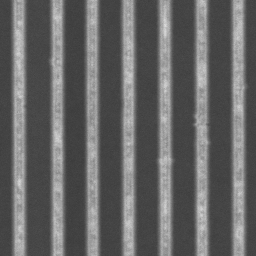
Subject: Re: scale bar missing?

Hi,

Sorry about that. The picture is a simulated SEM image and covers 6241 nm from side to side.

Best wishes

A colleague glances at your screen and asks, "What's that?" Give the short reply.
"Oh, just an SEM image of parallel lines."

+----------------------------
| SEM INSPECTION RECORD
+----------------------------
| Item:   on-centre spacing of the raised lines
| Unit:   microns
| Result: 0.891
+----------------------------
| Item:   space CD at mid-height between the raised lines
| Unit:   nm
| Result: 610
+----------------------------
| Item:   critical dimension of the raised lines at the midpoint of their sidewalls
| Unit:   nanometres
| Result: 271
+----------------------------